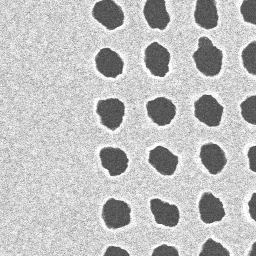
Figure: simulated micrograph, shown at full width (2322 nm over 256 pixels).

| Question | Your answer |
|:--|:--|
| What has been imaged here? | a regular array of holes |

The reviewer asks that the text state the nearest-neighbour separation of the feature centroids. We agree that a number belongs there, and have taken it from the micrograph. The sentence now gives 437 nanometres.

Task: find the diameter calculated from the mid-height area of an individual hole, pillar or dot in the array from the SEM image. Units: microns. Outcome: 0.257